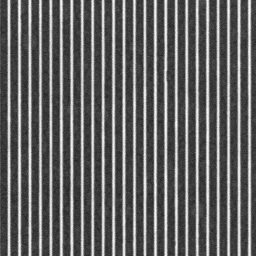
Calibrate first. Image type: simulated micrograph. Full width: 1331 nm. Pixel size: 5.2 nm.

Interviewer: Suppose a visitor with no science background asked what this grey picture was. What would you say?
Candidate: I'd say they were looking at parallel lines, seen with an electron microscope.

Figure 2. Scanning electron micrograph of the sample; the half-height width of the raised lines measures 7.8 nm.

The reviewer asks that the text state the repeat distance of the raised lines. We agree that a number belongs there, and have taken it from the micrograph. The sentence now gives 54.4 nm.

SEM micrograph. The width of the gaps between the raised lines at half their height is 0.0461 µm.